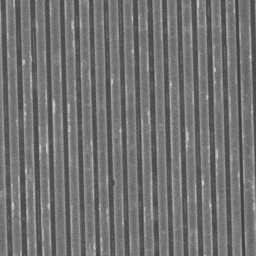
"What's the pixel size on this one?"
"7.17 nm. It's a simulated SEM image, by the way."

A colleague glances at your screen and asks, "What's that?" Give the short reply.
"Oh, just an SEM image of parallel lines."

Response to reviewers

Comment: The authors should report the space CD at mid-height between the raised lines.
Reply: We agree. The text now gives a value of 42.1 nanometers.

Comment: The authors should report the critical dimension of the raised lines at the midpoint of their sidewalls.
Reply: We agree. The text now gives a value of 64.5 nanometers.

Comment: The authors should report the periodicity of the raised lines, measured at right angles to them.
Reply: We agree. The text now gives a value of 105 nm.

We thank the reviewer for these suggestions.